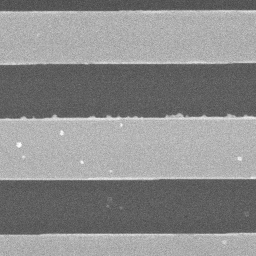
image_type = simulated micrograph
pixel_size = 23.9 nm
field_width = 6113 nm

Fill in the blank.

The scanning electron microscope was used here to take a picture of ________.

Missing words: lines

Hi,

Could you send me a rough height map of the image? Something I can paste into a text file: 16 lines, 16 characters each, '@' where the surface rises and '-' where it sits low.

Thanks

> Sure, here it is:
----------------
@@@@@@@@@@@@@@@@
@@@@@@@@@@@@@@@@
@@@@@@@@@@@@@@@@
----------------
----------------
----------------
@@@@@@@@@@@@@@@@
@@@@@@@@@@@@@@@@
@@@@@@@@@@@@@@@@
@@@@@@@@@@@@@@@@
----------------
----------------
----------------
----------------
@@@@@@@@@@@@@@@@